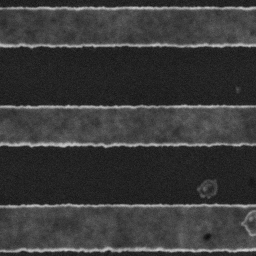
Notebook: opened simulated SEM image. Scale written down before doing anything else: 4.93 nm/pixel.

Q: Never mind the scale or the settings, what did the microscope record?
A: lines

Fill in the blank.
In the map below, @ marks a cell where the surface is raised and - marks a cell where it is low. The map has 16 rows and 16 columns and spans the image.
@@@@@@@@@@@@@@@@
@@@@@@@@@@@@@@@@
@@@@@@@@@@@@@@@@
----------------
----------------
----------------
----------------
@@@@@@@@@@@@@@@@
@@@@@@@@@@@@@@@@
----------------
----------------
----------------
----------------
@@@@@@@@@@@@@@@@
@@@@@@@@@@@@@@@@
@@@@@@@@@@@@@@@@